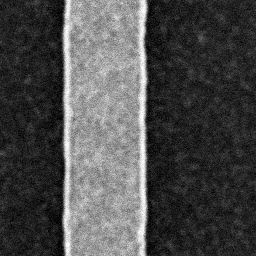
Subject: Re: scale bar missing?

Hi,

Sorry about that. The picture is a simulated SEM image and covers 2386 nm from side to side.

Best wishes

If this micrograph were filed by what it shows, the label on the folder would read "one or a few lines or trenches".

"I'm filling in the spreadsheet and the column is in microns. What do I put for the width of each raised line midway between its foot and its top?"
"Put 0.708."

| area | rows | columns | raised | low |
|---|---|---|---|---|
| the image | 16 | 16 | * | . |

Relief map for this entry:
....*****.......
....*****.......
....*****.......
....*****.......
....*****.......
....*****.......
....*****.......
....*****.......
....*****.......
....*****.......
....*****.......
....*****.......
....*****.......
....*****.......
....*****.......
....*****.......